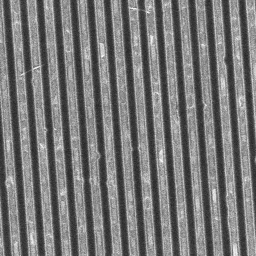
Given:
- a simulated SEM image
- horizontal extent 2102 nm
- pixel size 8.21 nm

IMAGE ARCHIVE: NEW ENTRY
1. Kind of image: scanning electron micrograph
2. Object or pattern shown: parallel lines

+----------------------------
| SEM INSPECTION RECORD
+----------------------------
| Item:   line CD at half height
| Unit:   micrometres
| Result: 0.0788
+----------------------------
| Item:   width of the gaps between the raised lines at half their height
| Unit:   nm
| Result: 57.3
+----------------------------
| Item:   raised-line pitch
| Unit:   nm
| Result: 138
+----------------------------